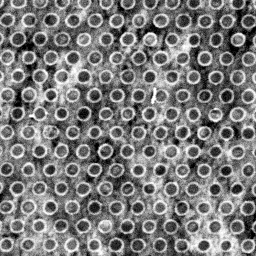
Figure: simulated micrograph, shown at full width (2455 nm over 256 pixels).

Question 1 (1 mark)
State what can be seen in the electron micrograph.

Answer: a regular array of raised bodies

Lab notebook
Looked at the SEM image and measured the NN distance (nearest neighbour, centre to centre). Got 204 nm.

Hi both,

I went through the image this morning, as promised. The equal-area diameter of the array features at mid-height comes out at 127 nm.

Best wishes